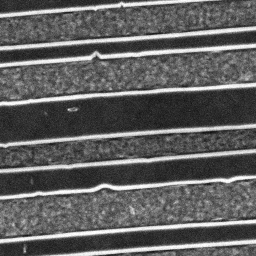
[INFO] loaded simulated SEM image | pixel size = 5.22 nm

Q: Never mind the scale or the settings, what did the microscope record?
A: one or a few lines or trenches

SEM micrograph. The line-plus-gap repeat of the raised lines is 335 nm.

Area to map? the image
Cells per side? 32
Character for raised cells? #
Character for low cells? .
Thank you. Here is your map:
###################.............
######..........................
................................
................................
....................############
.......#########################
#####################...........
########........................
................................
................................
................................
..................##############
.....###########################
################################
################################
################################
#####################...........
########........................
................................
........................########
...........#####################
################################
#############################...
#############.##................
###.............................
................................
................................
................................
...................#############
.......#########################
############################....
###############.................